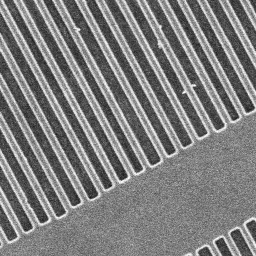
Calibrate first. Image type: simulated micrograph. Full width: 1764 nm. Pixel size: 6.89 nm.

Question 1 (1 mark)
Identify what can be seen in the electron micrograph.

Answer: parallel lines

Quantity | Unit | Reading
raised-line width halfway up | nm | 47.8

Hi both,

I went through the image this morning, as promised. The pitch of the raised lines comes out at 124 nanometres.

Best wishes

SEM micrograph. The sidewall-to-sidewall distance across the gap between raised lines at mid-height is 75.2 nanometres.